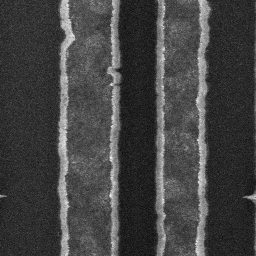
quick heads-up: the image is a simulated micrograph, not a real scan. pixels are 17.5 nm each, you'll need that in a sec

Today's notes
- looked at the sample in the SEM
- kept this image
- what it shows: one or a few lines or trenches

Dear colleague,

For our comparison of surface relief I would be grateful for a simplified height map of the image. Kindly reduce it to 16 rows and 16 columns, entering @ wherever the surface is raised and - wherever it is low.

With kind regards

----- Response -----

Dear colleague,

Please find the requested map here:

----@@@---@@@---
----@@@---@@@---
----@@@---@@@---
----@@@---@@@---
----@@@---@@@---
----@@@---@@@---
----@@@---@@@---
----@@@---@@@---
----@@@---@@@---
----@@@---@@@---
----@@@---@@@---
----@@@---@@@---
----@@@---@@@---
----@@@---@@@---
----@@@---@@@---
----@@@---@@@---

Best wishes